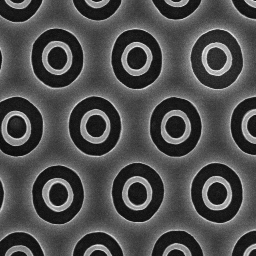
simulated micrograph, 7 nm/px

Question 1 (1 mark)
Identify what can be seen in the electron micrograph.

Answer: ring-shaped grooves with a dot in the middle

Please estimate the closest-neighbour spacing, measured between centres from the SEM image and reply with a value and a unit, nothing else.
542 nm